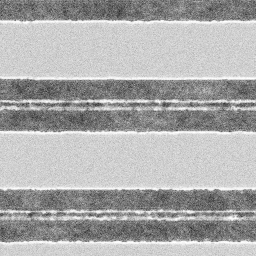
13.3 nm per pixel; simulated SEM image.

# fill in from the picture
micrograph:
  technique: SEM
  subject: lines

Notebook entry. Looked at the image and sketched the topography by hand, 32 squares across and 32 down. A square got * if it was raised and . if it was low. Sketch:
................................
................................
................................
********************************
********************************
********************************
********************************
********************************
********************************
********************************
................................
................................
................................
................................
................................
................................
................................
********************************
********************************
********************************
********************************
********************************
********************************
********************************
................................
................................
**...**.***.....................
................................
................................
................................
********************************
********************************